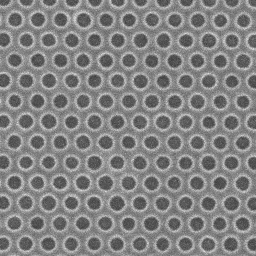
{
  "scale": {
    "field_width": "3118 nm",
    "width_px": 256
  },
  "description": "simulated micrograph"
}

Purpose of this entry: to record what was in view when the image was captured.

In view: a regular array of holes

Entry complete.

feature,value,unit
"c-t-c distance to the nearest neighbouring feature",276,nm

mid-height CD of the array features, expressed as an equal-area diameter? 176 nm